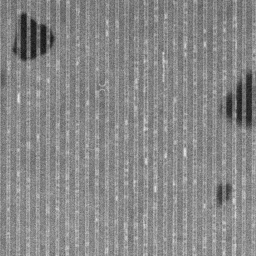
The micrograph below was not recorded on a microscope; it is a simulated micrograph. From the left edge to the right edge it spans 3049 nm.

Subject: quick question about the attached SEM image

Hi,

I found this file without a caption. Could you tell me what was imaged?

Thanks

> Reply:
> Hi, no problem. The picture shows parallel lines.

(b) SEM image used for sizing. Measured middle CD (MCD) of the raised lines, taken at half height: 41.7 nm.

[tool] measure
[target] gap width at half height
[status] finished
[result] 76 nanometres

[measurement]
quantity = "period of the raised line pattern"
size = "117 nanometres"